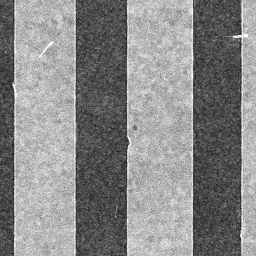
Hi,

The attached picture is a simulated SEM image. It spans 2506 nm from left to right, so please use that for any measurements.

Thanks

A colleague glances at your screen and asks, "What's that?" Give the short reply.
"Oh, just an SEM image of one or a few lines or trenches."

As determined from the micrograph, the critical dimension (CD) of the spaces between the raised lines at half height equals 497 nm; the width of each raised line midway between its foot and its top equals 593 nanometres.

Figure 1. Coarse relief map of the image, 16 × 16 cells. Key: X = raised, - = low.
-XXXX---XXXX---X
-XXXX---XXXX---X
-XXXX---XXXX---X
-XXXX---XXXX---X
-XXXX---XXXX---X
-XXXX---XXXX---X
-XXXX---XXXX---X
-XXXX---XXXX---X
-XXXX---XXXX---X
-XXXX---XXXX---X
-XXXX---XXXX---X
-XXXX---XXXX---X
-XXXX---XXXX---X
-XXXX---XXXX---X
-XXXX---XXXX---X
-XXXX---XXXX---X